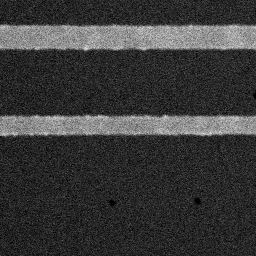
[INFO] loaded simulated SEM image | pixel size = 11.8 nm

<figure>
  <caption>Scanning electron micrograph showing one or a few lines or trenches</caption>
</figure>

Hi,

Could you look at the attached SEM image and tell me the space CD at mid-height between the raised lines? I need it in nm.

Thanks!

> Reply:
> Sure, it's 804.